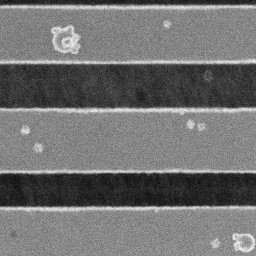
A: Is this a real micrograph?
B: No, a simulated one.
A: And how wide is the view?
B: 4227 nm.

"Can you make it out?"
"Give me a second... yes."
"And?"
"lines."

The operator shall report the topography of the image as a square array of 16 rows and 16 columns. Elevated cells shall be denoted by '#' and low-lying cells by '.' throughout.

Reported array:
################
################
################
################
................
................
................
################
################
################
################
................
................
################
################
################